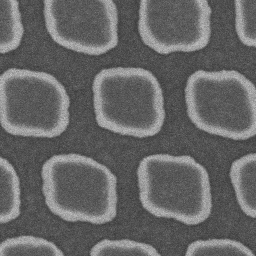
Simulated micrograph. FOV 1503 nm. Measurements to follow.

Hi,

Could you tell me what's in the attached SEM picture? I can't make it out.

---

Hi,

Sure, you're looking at raised bodies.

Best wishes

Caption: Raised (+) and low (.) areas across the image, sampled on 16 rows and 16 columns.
+..++++..++++..+
+..++++..++++..+
+...+++..++++..+
................
.+.....++.......
++++..++++..++++
++++..++++..++++
++++..++++..++++
................
................
+..+++...++++..+
+..++++..++++..+
+..++++..++++..+
+...+++....++...
................
+++...+++...+++.